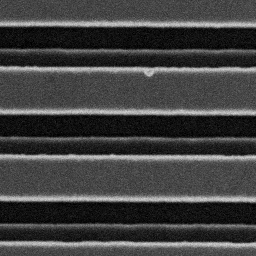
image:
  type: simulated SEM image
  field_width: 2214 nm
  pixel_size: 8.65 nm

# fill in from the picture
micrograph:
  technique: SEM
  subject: lines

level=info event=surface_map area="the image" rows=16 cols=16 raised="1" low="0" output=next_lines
1111111111111111
1111111111111111
0000000000000000
0000000000000000
1111111111111111
1111111111111111
1111111111111111
0000000000000000
0000000000000000
0000000000000000
1111111111111111
1111111111111111
1111111111111111
0000000000000000
0000000000000000
1111111111111111